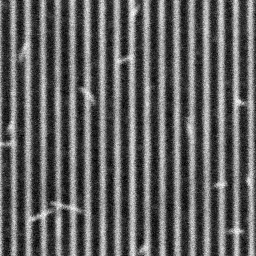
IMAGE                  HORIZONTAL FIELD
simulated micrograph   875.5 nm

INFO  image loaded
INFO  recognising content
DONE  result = parallel lines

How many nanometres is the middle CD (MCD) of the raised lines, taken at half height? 12.8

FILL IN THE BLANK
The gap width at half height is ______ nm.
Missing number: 38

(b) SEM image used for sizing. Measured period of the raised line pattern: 50.8 nanometres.